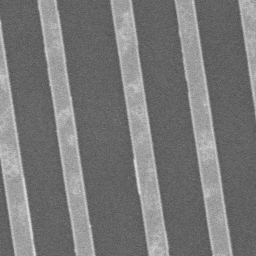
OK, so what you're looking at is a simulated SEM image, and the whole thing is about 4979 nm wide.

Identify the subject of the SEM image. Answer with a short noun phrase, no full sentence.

one or a few lines or trenches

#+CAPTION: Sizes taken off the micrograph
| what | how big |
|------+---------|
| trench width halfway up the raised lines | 873 nanometers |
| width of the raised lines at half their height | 346 nm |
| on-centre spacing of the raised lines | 1300 nm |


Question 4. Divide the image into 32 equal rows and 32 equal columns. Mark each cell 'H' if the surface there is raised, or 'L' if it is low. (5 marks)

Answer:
LLLLLHHLLLLLLLHHLLLLLLHHLLLLLLHH
LLLLLHHLLLLLLLHHHLLLLLHHLLLLLLHH
LLLLLHHLLLLLLLHHHLLLLLHHLLLLLLHH
LLLLLHHLLLLLLLHHHLLLLLHHHLLLLLHH
LLLLLLHHLLLLLLLHHLLLLLLHHLLLLLLH
LLLLLLHHLLLLLLLHHLLLLLLHHLLLLLLH
HLLLLLHHLLLLLLLHHLLLLLLHHLLLLLLH
HLLLLLHHLLLLLLLHHLLLLLLHHLLLLLLH
HLLLLLHHLLLLLLLHHLLLLLLHHLLLLLLH
HLLLLLHHLLLLLLLHHHLLLLLHHHLLLLLH
HLLLLLHHHLLLLLLHHHLLLLLHHHLLLLLH
HLLLLLHHHLLLLLLLHHLLLLLLHHLLLLLL
HLLLLLLHHLLLLLLLHHLLLLLLHHLLLLLL
HHLLLLLHHLLLLLLLHHLLLLLLHHLLLLLL
HHLLLLLHHLLLLLLLHHLLLLLLHHLLLLLL
HHLLLLLHHLLLLLLLHHHLLLLLHHLLLLLL
HHLLLLLHHLLLLLLLHHHLLLLLHHHLLLLL
HHLLLLLHHHLLLLLLHHHLLLLLHHHLLLLL
HHLLLLLLHHLLLLLLLHHLLLLLLHHLLLLL
HHLLLLLLHHLLLLLLLHHLLLLLLHHLLLLL
HHHLLLLLHHLLLLLLLHHLLLLLLHHLLLLL
HHHLLLLLHHLLLLLLLHHLLLLLLHHLLLLL
LHHLLLLLHHLLLLLLLHHHLLLLLHHLLLLL
LHHLLLLLHHLLLLLLLHHHLLLLLHHHLLLL
LHHLLLLLHHHLLLLLLLHHLLLLLLHHLLLL
LHHLLLLLLHHLLLLLLLHHLLLLLLHHLLLL
LHHHLLLLLHHLLLLLLLHHLLLLLLHHLLLL
LHHHLLLLLHHLLLLLLLHHLLLLLLHHLLLL
LHHHLLLLLHHLLLLLLLHHHLLLLLHHLLLL
LLHHLLLLLHHLLLLLLLHHHLLLLLHHHLLL
LLHHLLLLLHHHLLLLLLHHHLLLLLHHHLLL
LLHHLLLLLHHHLLLLLLLHHLLLLLLHHLLL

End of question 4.